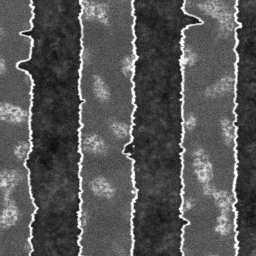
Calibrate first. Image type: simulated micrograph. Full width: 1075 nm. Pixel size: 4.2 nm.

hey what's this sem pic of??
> one or a few lines or trenches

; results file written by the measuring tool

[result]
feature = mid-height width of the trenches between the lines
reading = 207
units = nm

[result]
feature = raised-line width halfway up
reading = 223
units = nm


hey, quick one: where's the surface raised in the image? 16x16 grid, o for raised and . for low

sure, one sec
oo...ooo....ooo.
oo...ooo....ooo.
oo...ooo...oooo.
oo...ooo...oooo.
oo...ooo...oooo.
oo...ooo...oooo.
oo...ooo...oooo.
oo...ooo...oooo.
oo...ooo...oooo.
oo...ooo...oooo.
oo...ooo...oooo.
oo...ooo...oooo.
oo...ooo...oooo.
oo...ooo...oooo.
oo...ooo...oooo.
oo...ooo...oooo.